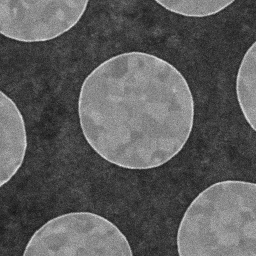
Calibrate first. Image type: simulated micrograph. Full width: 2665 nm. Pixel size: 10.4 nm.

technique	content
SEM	raised bodies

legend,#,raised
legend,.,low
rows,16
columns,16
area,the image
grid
#####.....####..
#####...........
.##.............
.......##......#
......#####....#
.....#######...#
#....#######...#
#....#######...#
##...#######....
##....#####.....
#.......#.......
..............##
............####
....##......####
..######...#####
..######...#####